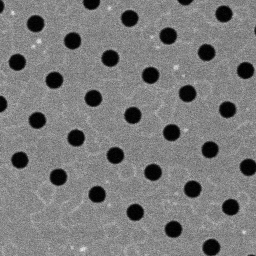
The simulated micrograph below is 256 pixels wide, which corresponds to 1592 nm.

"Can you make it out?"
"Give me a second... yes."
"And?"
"a regular array of holes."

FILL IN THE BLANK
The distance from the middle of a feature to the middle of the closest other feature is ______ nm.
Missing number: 260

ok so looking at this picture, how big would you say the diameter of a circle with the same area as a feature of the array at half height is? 108 nm